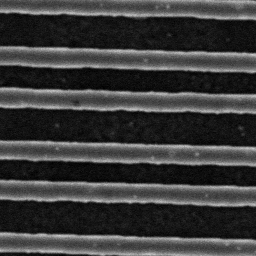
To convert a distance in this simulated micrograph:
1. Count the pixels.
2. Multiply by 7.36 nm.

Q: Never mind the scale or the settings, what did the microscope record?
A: lines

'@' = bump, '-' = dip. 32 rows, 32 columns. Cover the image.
@@@@@@@@@@@@@@@@@@@@@@@@@@@@@@@@
@@@@@@@@@@@@@@@@@@@@@@@@@@@@@@@@
--------------------------------
--------------------------------
--------------------------------
--------------------------------
@@@@@@@@@@@@@@@@@@@@@-----------
@@@@@@@@@@@@@@@@@@@@@@@@@@@@@@@@
--------------@@@@@@@@@@@@@@@@@@
--------------------------------
--------------------------------
@@@@@@@@@@@@@@@@@-@-------------
@@@@@@@@@@@@@@@@@@@@@@@@@@@@@@@@
-----@@@@@@@@@@@@@@@@@@@@@@@@@@@
--------------------------------
--------------------------------
--------------------------------
--------------------------------
@@@@@@@@@@@@@@@@@@@@@@@@@@@@@@@@
@@@@@@@@@@@@@@@@@@@@@@@@@@@@@@@@
-----------------------@@--@@@@@
--------------------------------
--------------------------------
@@@@@@@@@@@@@@@@@@@@@@@@@@@@@@@@
@@@@@@@@@@@@@@@@@@@@@@@@@@@@@@@@
------------------------@@@@@@@@
--------------------------------
--------------------------------
--------------------------------
@@@@@@@@@@@@@@@@----------------
@@@@@@@@@@@@@@@@@@@@@@@@@@@@@@@@
---@@@@@@@@@@@@@@@@@@@@@@@@@@@@@